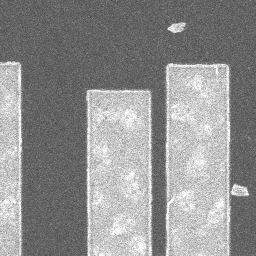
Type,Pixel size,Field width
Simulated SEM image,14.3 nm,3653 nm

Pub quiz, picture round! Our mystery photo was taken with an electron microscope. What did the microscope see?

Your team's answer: one or a few lines or trenches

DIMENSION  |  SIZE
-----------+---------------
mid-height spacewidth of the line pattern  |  59.9 pixels